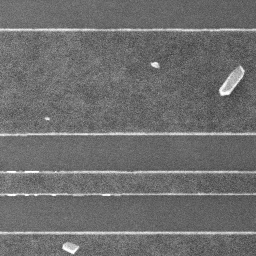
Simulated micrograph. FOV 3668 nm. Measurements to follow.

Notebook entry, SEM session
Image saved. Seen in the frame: lines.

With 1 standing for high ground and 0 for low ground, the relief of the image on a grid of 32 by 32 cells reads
00000000000000000000000000000000
00000000000000000000000000000000
00000000000000000000000000000000
00000000000000000000000000000000
11111111111111111111111111111111
11111111111111111111111111111111
11111111111111111111111111111111
11111111111111111111111111111111
11111111111111111111111111111111
11111111111111111111111111111111
11111111111111111111111111111111
11111111111111111111111111111111
11111111111111111111111111111111
11111111111111111111111111111111
11111111111111111111111111111111
11111111111111111111111111111111
11111111111111111111111111111111
00000000000000000000000000000000
00000000000000000000000000000000
00000000000000000000000000000000
00000000000000000000000000000000
00000000000000000000000000000000
11111111111111111111111111111111
11111111111111111111111111111111
00000000000000000000000000000000
00000000000000000000000000000000
00000000000000000000000000000000
00000000000000000000000000000000
00000000000000000000000000000000
11111111111111111111111111111111
11111111111111111111111111111111
11111111111111111111111111111111